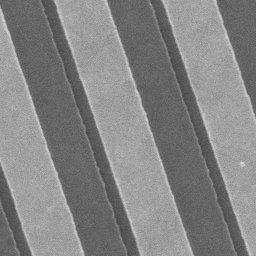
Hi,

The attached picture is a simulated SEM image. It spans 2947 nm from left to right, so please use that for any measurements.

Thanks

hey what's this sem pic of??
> lines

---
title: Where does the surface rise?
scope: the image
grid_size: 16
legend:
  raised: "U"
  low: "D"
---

DDDDUUUDDDUUUUDD
DDDDUUUDDDDUUUDD
UDDDUUUUDDDUUUDD
UDDDDUUUDDDUUUUD
UDDDDUUUDDDDUUUD
UUDDDUUUUDDDUUUD
UUDDDDUUUDDDUUUU
UUDDDDUUUDDDDUUU
UUUDDDUUUUDDDUUU
UUUDDDDUUUDDDUUU
UUUDDDDUUUDDDDUU
DUUUDDDUUUUDDDUU
DUUUDDDDUUUDDDUU
DUUUDDDDUUUDDDDU
DDUUUDDDUUUUDDDU
DDUUUDDDDUUUDDDU